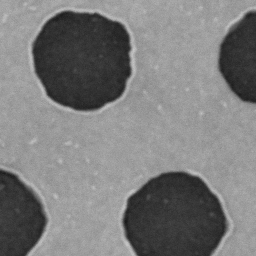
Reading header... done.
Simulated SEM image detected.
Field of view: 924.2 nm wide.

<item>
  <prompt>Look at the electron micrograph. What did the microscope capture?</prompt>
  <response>holes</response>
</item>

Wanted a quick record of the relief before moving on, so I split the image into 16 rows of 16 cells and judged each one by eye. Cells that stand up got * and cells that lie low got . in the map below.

****************
***.....*******.
**......******..
**......******..
**......******..
***.....******..
****...*********
****************
****************
****************
****************
..*******....***
..******......**
...*****......**
...*****......**
..******......**